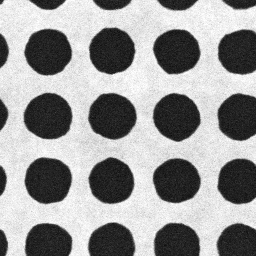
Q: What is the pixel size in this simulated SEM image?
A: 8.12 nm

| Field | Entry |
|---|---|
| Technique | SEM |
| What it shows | a regular array of holes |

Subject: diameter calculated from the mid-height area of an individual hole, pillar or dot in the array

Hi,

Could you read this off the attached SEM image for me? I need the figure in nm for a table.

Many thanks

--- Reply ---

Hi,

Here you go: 380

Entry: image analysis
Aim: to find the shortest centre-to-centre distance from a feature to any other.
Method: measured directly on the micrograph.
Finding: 517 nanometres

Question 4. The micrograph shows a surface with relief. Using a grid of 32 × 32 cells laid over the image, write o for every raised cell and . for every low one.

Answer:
oooo....oooo....oooo....oooo....
oooooooooooooooooooooooooooooooo
oooooooooooooooooooooooooooooooo
ooooooooooooo.oooooooooooooooooo
oooo....oooo....oooo....oooo....
.oo......oo......oo......oo.....
.oo......oo......oo......oo.....
.oo......oo......ooo.....oo.....
oooo....oooo....oooo....oooo....
oooooooooooooooooooooooooooooooo
oooooooooooooooooooooooooooooooo
oooooooooooooooooooooooooooooooo
oooo....oooo....oooo....oooo....
.oo......oo......oo......oo.....
.oo......oo......oo......oo.....
.oo......oo......oo......oo.....
oooo....oooo....oooo....oooo....
ooooooooooooooooooooo..oooooo..o
oooooooooooooooooooooooooooooooo
oooooooooooooooooooooooooooooooo
oooo....oooo....oooo....oooo....
.oo......oo.....ooo......oo.....
.oo......oo......oo......oo.....
.oo......oo......oo......oo.....
oooo....oooo....oooo....oooo....
ooooooooooooooooooooooooooooo..o
oooooooooooooooooooooooooooooooo
oooooooooooooooooooooooooooooooo
oooo....oooo....oooo....oooo....
.oo......oo......oo......oo.....
.oo......oo......oo......oo.....
.oo......oo......oo......oo.....